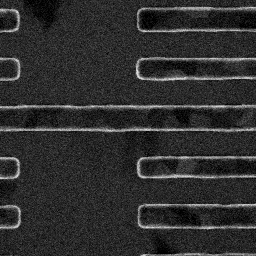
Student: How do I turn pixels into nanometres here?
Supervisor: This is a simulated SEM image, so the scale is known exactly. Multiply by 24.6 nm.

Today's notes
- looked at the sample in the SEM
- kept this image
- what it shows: wiring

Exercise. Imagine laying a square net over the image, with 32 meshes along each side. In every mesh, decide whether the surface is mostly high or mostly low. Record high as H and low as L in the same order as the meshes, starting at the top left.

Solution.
LLLLLLLLLLLLLLLLLLLLLLLLLLLLLLLL
HHLLLLLLLLLLLLLLLHHHHHHHHHHHHHHH
HHLLLLLLLLLLLLLLLHHHHHHHHHHHHHHH
HHLLLLLLLLLLLLLLLHHHHHHHHHHHHHHH
LLLLLLLLLLLLLLLLLLLLLLLLLLLLLLLL
LLLLLLLLLLLLLLLLLLLLLLLLLLLLLLLL
LLLLLLLLLLLLLLLLLLLLLLLLLLLLLLLL
HHLLLLLLLLLLLLLLLLHHHHHHHHHHHHHH
HHLLLLLLLLLLLLLLLHHHHHHHHHHHHHHH
HHLLLLLLLLLLLLLLLHHHHHHHHHHHHHHH
LLLLLLLLLLLLLLLLLLLLLLLLLLLLLLLL
LLLLLLLLLLLLLLLLLLLLLLLLLLLLLLLL
LLLLLLLLLLLLLLLLLLLLLLLLLLLLLLLL
HHHHHHHHHHHHHHHHHHHHHHHHHHHHHHHH
HHHHHHHHHHHHHHHHHHHHHHHHHHHHHHHH
HHHHHHHHHHHHHHHHHHHHHHHHHHHHHHHH
LLLLLLLLLLLLLLLLLLLLLLLLLLLLLLLL
LLLLLLLLLLLLLLLLLLLLLLLLLLLLLLLL
LLLLLLLLLLLLLLLLLLLLLLLLLLLLLLLL
LLLLLLLLLLLLLLLLLLLLLLLLLLLLLLLL
HHLLLLLLLLLLLLLLLHHHHHHHHHHHHHHH
HHLLLLLLLLLLLLLLLHHHHHHHHHHHHHHH
LLLLLLLLLLLLLLLLLLLLLLLLLLLLLLLL
LLLLLLLLLLLLLLLLLLLLLLLLLLLLLLLL
LLLLLLLLLLLLLLLLLLLLLLLLLLLLLLLL
LLLLLLLLLLLLLLLLLLLLLLLLLLLLLLLL
HHLLLLLLLLLLLLLLLHHHHHHHHHHHHHHH
HHLLLLLLLLLLLLLLLHHHHHHHHHHHHHHH
LLLLLLLLLLLLLLLLLLLLLLLLLLLLLLLL
LLLLLLLLLLLLLLLLLLLLLLLLLLLLLLLL
LLLLLLLLLLLLLLLLLLLLLLLLLLLLLLLL
LLLLLLLLLLLLLLLLLLLLLLLLLLLLLLLL